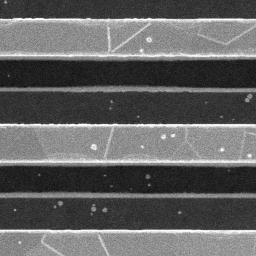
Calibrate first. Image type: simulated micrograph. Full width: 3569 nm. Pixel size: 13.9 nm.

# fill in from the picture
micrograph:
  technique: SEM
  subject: lines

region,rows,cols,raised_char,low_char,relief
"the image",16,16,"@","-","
@@@@@@@@@@@@@@@@
@@@@@@@@@@@@@@@@
@@@@@@@@@@@@@@@@
@@@@@@@@@@@@@@@@
----------------
----------------
@@@@@@@@@@@@@@@@
@@@@@@@@@@@@@@@@
@@@@@@@@@@@@@@@@
@@@@@@@@@@@@@@@@
----------------
----------------
@@@@@@@@@@@@@@@@
@@@@@@@@@@@@@@@@
@@@@@@@@@@@@@@@@
@@@@@@@@@@@@@@@@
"